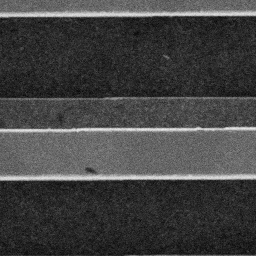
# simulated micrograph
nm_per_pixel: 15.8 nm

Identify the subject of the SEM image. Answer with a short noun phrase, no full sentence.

lines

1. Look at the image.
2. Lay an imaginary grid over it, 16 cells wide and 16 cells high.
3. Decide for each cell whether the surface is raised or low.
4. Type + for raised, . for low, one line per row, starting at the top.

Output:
++++++++++++++++
................
................
................
................
................
++++++++++++++++
++++++++++++++++
++++++++++++++++
++++++++++++++++
++++++++++++++++
................
................
................
................
................